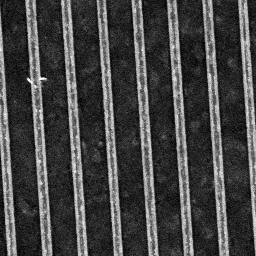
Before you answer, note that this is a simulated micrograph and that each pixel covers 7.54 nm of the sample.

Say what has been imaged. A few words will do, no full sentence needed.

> parallel lines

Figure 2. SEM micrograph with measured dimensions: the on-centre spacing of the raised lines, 266 nanometers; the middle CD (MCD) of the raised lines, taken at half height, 0.0583 um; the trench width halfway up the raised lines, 0.211 µm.